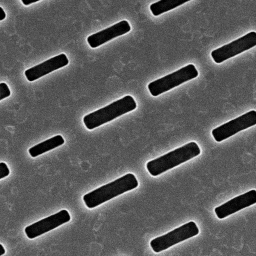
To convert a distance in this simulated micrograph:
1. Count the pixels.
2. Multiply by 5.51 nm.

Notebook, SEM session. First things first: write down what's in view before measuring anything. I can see a regular array of holes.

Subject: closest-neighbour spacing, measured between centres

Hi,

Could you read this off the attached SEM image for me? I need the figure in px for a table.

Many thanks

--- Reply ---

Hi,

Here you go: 71.2